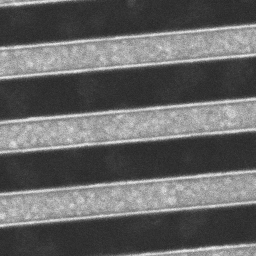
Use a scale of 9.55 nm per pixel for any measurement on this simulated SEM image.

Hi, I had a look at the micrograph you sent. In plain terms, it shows one or a few lines or trenches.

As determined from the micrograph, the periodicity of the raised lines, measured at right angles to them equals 697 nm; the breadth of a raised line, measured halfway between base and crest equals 415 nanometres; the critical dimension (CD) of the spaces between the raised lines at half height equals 0.274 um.